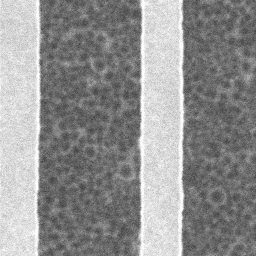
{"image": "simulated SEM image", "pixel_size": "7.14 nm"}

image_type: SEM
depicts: one or a few lines or trenches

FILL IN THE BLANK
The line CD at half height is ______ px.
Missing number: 39.6